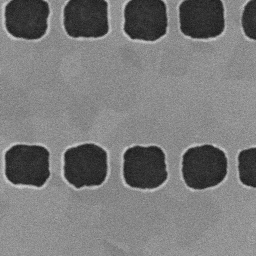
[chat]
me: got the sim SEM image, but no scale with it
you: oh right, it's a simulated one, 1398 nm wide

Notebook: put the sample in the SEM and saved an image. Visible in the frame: holes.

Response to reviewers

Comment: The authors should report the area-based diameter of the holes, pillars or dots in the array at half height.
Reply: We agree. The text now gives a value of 258 nanometers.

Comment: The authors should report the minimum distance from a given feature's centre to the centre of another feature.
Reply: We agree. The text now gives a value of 319 nanometres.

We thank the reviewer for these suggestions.